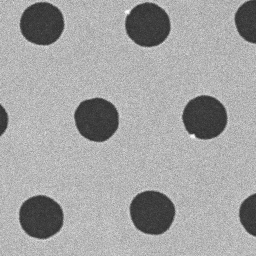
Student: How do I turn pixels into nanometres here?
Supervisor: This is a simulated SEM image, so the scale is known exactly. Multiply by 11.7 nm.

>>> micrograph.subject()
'holes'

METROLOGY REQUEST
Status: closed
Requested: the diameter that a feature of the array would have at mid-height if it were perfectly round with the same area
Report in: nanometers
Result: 526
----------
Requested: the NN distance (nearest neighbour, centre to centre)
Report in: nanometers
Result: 1260